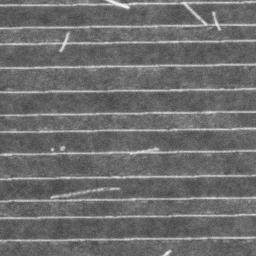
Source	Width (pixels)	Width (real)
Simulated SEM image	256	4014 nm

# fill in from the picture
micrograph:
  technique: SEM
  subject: lines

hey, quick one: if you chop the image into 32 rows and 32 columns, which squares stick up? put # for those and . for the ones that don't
.............###################
################################
################################
###.............................
................................
.....###########################
################################
################################
................................
................................
................................
.....###########################
################################
################################
................................
................................
.....###########################
################################
################################
................................
................................
................................
################################
################################
################################
................................
................................
################################
################################
################################
................................
................................